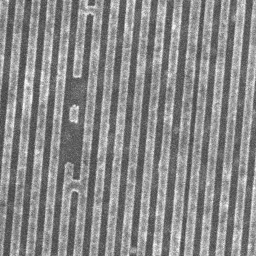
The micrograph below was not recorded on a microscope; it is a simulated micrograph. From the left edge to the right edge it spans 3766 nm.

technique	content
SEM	parallel lines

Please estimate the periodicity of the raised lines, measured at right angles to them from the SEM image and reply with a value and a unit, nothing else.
232 nm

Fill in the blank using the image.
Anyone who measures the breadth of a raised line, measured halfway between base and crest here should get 115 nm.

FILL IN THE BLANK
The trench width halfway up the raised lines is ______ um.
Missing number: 0.115